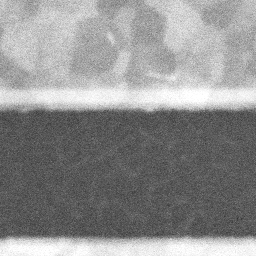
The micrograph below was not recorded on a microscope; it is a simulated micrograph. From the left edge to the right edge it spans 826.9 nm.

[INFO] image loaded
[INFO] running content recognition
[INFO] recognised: one or a few lines or trenches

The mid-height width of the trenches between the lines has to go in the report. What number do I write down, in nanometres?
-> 499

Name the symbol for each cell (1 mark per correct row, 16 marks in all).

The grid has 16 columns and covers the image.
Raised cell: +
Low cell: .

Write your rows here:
++++++++++++++++
++++++++++++++++
++++++++++++++++
++++++++++++++++
++++++++++++++++
++++++++++++++++
................
................
................
................
................
................
................
................
................
................